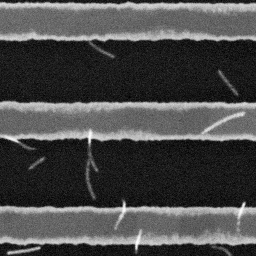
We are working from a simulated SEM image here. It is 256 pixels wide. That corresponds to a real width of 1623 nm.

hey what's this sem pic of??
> lines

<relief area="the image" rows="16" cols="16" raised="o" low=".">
oooooooooooooooo
oooooooooooooooo
................
................
................
................
o......oo...oo.o
oooooooooooooooo
oooooooooooooooo
................
................
................
................
oooooooooooooooo
oooooooooooooooo
................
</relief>